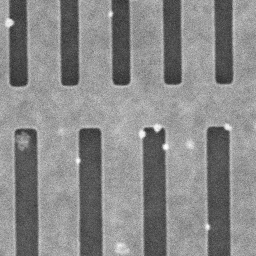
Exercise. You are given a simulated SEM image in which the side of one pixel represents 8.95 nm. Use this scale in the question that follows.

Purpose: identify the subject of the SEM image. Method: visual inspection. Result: groups of lines, slits or small figures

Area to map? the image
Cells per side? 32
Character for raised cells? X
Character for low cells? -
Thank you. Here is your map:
X--XXXX---XXXX--XXXX---XXXX--XXX
X--XXXX---XXXX--XXXX---XXXX--XXX
X--XXXX---XXXX--XXXX---XXXX--XXX
X--XXXX---XXXX--XXXX---XXXX--XXX
X---XXX---XXXX--XXXX---XXXX--XXX
X---XXX---XXXX--XXXX---XXXX--XXX
X---XXX---XXXX--XXXX---XXXX--XXX
X---XXX---XXXX--XXXX---XXXX--XXX
X---XXX---XXXX--XXXX---XXXX--XXX
X---XXX---XXXX--XXXX---XXXX--XXX
X--XXXXX--XXXX--XXXXX-XXXXX--XXX
XXXXXXXXXXXXXXXXXXXXXXXXXXXXXXXX
XXXXXXXXXXXXXXXXXXXXXXXXXXXXXXXX
XXXXXXXXXXXXXXXXXXXXXXXXXXXXXXXX
XXXXXXXXXXXXXXXXXXXXXXXXXXXXXXXX
XXXXXXXXXXXXXXXXXXXXXXXXXXXXXXXX
XX---XXXXX---XXXXX---XXXXX---XXX
XX---XXXXX---XXXXX---XXXXX---XXX
XX---XXXXX---XXXXX---XXXXX---XXX
XX---XXXXX---XXXXX---XXXXX---XXX
XX---XXXXX---XXXXX---XXXXX---XXX
XX---XXXXX---XXXXX---XXXXX---XXX
XX---XXXXX---XXXXX---XXXXX---XXX
XX---XXXXX---XXXXX---XXXXX---XXX
XX---XXXXX---XXXXX---XXXXX---XXX
XX---XXXXX---XXXXX---XXXXX---XXX
XX---XXXXX---XXXXX---XXXXX---XXX
XX---XXXXX---XXXXX---XXXXX---XXX
XX---XXXXX---XXXXX---XXXXX---XXX
XX---XXXXX---XXXXX---XXXXX---XXX
XX---XXXXX---XXXXX---XXXXX---XXX
XX---XXXXX---XXXXX---XXXXX---XXX